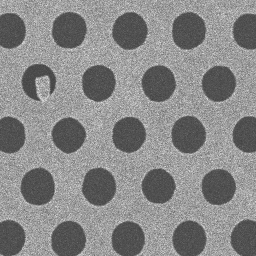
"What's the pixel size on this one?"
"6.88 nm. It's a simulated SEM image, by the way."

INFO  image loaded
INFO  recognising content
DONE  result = a regular array of holes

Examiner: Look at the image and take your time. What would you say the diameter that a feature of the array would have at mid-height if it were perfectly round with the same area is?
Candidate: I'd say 244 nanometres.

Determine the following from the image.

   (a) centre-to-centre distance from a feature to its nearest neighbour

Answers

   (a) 59.1 px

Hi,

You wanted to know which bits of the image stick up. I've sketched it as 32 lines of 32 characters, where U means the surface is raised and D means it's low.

UUUUUUUUUUUUUUUUUUUUUUUUUUUUUUUU
UUUUUUUUUUUUUUUUUUUUUUUUUUUUUUUU
DDDUUUUDDDDUUUUDDDUUUUDDDUUUUUDD
DDDUUUUDDDDUUUDDDDUUUUDDDDUUUDDD
DDDUUUUDDDDUUUDDDDUUUUDDDDUUUDDD
DDDUUUUDDDUUUUUDDDUUUUDDDUUUUUDD
UUUUUUUUUUUUUUUUUUUUUUUUUUUUUUUU
UUUUUUUUUUUUUUUUUUUUUUUUUUUUUUUU
UUUUDDUUUUUDDUUUUUUDDUUUUUDDDUUU
UUUDDDDUUUDDDDUUUUDDDDUUUDDDDUUU
UUUDDUDUUUDDDDUUUUDDDDUUUDDDDDUU
UUUDDUUUUUDDDDUUUUDDDDUUUDDDDUUU
UUUUUUUUUUUDDUUUUUUDDUUUUUDDUUUU
UUUUUUUUUUUUUUUUUUUUUUUUUUUUUUUU
UUUUUUUUUUUUUUUUUUUUUUUDUUUUUUUU
DDDUUUUDDDUUUUDDDDUUUUDDDUUUUUDD
DDDUUUDDDDDUUUDDDDUUUDDDDDUUUDDD
DDDUUUUDDDDUUUDDDDUUUDDDDDUUUDDD
DDDUUUUDDDUUUUUDDUUUUUDDDUUUUUDD
UUUUUUUUUUUUUUUUUUUUUUUUUUUUUUUU
UUUUUUUUUUUUUUUUUUUUUUUUUUUUUUUU
UUUDDDUUUUUDDDUUUUUDDUUUUUDDDUUU
UUUDDDDUUUDDDDUUUUDDDDUUUDDDDUUU
UUUDDDDUUUDDDDUUUUDDDDUUUDDDDUUU
UUUDDDDUUUUDDDUUUUDDDDUUUDDDDUUU
UUUUDDUUUUUDDUUUUUUUUUUUUUUDUUUU
UUUUUUUUUUUUUUUUUUUUUUUUUUUUUUUU
UUUUUUUUUUUUUUUUUUUUUUUUUUUUUUDU
DDDUUUUDDDUUUUDDDDUUUUDDDUUUUDDD
DDDUUUDDDDDUUUDDDDUUUUDDDDUUUDDD
DDDUUUDDDDDUUUDDDDUUUUDDDDUUUDDD
DDUUUUUDDDUUUUUDDDUUUUDDDUUUUUDD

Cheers